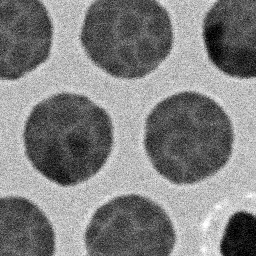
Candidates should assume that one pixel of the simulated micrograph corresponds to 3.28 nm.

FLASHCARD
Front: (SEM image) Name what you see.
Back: holes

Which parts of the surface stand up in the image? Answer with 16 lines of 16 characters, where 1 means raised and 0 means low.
0001110000111000
0001100000011000
0001100000011000
0001100000111000
0011111001111100
1111111111111111
1100001111000011
1100000110000011
1000000110000001
1100000110000011
1100001111000011
1111011111101111
0011111001111111
0001110000011110
0001100000011100
0001100000011100